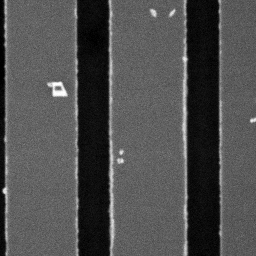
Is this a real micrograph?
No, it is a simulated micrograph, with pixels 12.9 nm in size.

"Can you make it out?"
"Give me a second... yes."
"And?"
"lines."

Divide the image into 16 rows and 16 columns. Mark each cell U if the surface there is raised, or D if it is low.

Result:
UUUUUDDUUUUUDDUU
UUUUUDDUUUUUDDUU
UUUUUDDUUUUUDDUU
UUUUUDDUUUUUDDUU
UUUUUDDUUUUUDDUU
UUUUUDDUUUUUDDUU
UUUUUDDUUUUUDDUU
UUUUUDDUUUUUDDUU
UUUUUDDUUUUUDDUU
UUUUUDDUUUUUDDUU
UUUUUDDUUUUUDDUU
UUUUUDDUUUUUDDUU
UUUUUDDUUUUUDDUU
UUUUUDDUUUUUDDUU
UUUUUDDUUUUUDDUU
UUUUUDDUUUUUDDUU